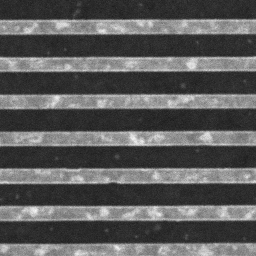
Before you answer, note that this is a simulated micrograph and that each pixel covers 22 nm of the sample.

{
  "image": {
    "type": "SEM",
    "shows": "parallel lines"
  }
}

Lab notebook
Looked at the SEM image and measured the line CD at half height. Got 286 nm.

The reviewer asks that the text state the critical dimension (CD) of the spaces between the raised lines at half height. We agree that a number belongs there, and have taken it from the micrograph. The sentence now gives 526 nm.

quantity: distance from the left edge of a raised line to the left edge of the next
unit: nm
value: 820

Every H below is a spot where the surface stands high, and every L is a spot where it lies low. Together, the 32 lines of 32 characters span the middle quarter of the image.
HHHHHHHHHHHHHHHHHHHHHHHHHHHHHHHH
HHHHHLLLLLLLLLLLLHHHHHHHHHHHHHHH
LLLLLLLLLLLLLLLLLLLLLLLLLLLLLLLL
LLLLLLLLLLLLLLLLLLLLLLLLLLLLLLLL
LLLLLLLLLLLLLLLLLLLLLLLLLLLLLLLL
LLLLLLLLLLLLLLLLLLLLLLLLLLLLLLLL
LLLLLLLLLLLLLLLLLLLLLLLLLLLLLLLL
LLLLLLLLLLLLLLLLLLLLLLLLLLLLLLLL
HHHHHHHHHHHHHHHHHHHHHHHHHHHHHHHH
HHHHHHHHHHHHHHHHHHHHHHHHHHHHHHHH
HHHHHHHHHHHHHHHHHHHHHHHHHHHHHHHH
LLLLLLLLLLLLLLLLLLLLLLLLLLLLLLLL
LLLLLLLLLLLLLLLLLLLLLLLLLLLLLLLL
LLLLLLLLLLLLLLLLLLLLLLLLLLLLLLLL
LLLLLLLLLLLLLLLLLLLLLLLLLLLLLLLL
LLLLLLLLLLLLLLLLLLLLLLLLLLLLLLLL
LLLLLLLLLLLLLLLLLLLLLLLLLLLLLLLL
HHHHHHHHHHHHHHHHHHHHHHHHHHHHHHHH
HHHHHHHHHHHHHHHHHHHHHHHHHHHHHHHH
HHHHHHHHHHHHHHHHHHHHHHHHHHHHHHHH
LLLLLLLLLLLLLLLLLLLLLLLLLLLLLLLL
LLLLLLLLLLLLLLLLLLLLLLLLLLLLLLLL
LLLLLLLLLLLLLLLLLLLLLLLLLLLLLLLL
LLLLLLLLLLLLLLLLLLLLLLLLLLLLLLLL
LLLLLLLLLLLLLLLLLLLLLLLLLLLLLLLL
LLLLLLLLLLLLLLLLLLLLLLLLLLLLLLLL
HLLHHHHHHHLLLLLLLLLLLLLLLLLLHHHH
HHHHHHHHHHHHHHHHHHHHHHHHHHHHHHHH
HHHHHHHHHHHHHHHHHHHHHHHHHHHHHHHH
HHHHHHHHHHHHHHHHHHLLLHHLLLLLLLLL
LLLLLLLLLLLLLLLLLLLLLLLLLLLLLLLL
LLLLLLLLLLLLLLLLLLLLLLLLLLLLLLLL